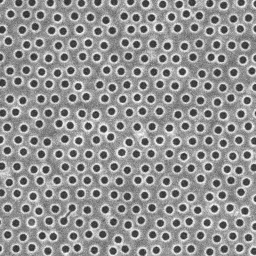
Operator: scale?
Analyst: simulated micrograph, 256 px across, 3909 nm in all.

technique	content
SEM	a regular array of holes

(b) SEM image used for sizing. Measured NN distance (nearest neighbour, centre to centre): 0.205 um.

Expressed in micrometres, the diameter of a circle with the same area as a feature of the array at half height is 0.127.